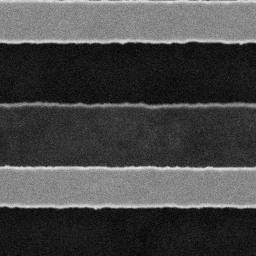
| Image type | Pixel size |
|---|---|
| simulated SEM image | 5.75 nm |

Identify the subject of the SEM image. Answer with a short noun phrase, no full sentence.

lines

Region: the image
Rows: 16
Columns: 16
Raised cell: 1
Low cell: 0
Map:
1111111111111111
1111111111111111
1111111111111111
0000000000000000
0000000000000000
0000000000000000
0010000000000000
1111111111111111
1111111111111111
1111111111111111
1111111111111111
1111111111111111
1111111111111111
0000000000000000
0000000000000000
0000000000000000